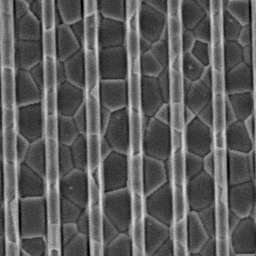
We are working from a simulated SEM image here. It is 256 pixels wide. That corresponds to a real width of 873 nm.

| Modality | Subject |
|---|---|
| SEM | parallel lines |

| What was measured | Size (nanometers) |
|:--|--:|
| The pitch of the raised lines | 143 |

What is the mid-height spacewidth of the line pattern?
98.7 nm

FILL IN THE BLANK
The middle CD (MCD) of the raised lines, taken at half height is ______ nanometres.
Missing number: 43.4